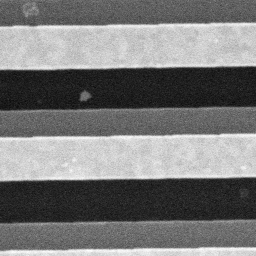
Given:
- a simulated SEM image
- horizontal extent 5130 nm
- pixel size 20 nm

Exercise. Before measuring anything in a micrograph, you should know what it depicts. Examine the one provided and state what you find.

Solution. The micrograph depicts lines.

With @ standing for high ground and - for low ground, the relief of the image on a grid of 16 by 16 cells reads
@@@@@@@@@@@@@@@@
@@@@@@@@@@@@@@@@
@@@@@@@@@@@@@@@@
@@@@@@@@@@@@@@@@
----------------
----------------
----------------
@@@@@@@@@@@@@@@@
@@@@@@@@@@@@@@@@
@@@@@@@@@@@@@@@@
@@@@@@@@@@@@@@@@
----------------
----------------
----------------
@@@@@@@@@@@@@@@@
@@@@@@@@@@@@@@@@